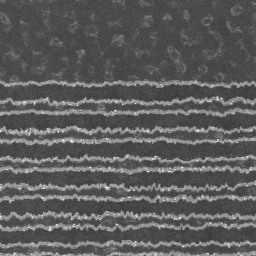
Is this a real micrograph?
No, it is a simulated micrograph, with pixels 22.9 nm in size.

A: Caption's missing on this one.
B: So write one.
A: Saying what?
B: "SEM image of parallel lines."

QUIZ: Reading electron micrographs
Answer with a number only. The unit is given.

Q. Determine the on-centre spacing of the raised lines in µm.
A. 0.655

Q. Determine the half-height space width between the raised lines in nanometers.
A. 401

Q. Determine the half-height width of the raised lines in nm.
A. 244